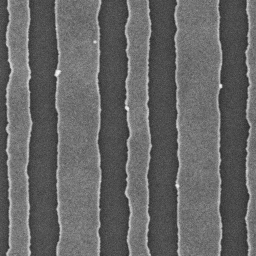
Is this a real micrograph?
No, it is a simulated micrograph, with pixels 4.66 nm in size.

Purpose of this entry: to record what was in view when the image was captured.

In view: lines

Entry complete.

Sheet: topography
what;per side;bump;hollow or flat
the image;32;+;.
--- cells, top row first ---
.+++...++++++...+++...+++++....+
.+++...+++++....+++...+++++....+
.+++...+++++....+++...+++++....+
.+++...+++++....+++...+++++....+
.+++...+++++....+++...+++++....+
.+++...+++++....+++...++++++...+
.+++...+++++....+++...++++++...+
.+++...+++++....+++...++++++...+
.+++...+++++....+++...++++++...+
.+++...+++++....+++...+++++....+
.+++...+++++....+++...++++++...+
.+++...+++++....++....+++++....+
.+++...+++++....+++...+++++....+
.+++...++++++...+++...+++++....+
.+++...+++++....+++...+++++....+
.+++...+++++....+++...+++++....+
.+++...+++++....+++...+++++....+
.+++...+++++....+++...+++++....+
.+++...+++++....+++...+++++....+
.+++...+++++....+++...+++++....+
.++....+++++....+++...+++++....+
.++....++++++...++....+++++....+
.+++...++++++...++....++++++...+
.+++...+++++....+++...++++++...+
.+++...+++++....+++...++++++...+
.+++...+++++....+++...+++++....+
.+++...+++++....+++...+++++....+
.+++...+++++....+++...++++++...+
.+++...+++++....+++...++++++...+
.+++...+++++....++....++++++...+
.+++...+++++....++....++++++...+
.+++...+++++....+++...++++++...+